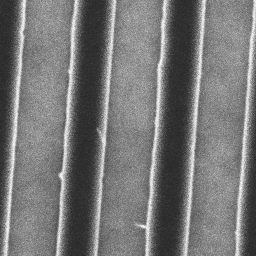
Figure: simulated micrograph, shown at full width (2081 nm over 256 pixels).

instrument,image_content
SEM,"one or a few lines or trenches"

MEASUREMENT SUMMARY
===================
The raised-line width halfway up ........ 324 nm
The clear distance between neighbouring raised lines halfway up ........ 49.6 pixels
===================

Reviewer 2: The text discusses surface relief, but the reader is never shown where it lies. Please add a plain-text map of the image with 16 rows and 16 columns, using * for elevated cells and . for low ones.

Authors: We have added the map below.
**...**...***...
*....**...***...
*....**...***...
*...***...***...
*...***...**....
*...***...**....
*...***...**...*
*...***...**...*
*...***...**...*
*...**....**...*
*...**....**...*
*...**...***...*
*...**...***...*
*...**...***...*
*...**...***...*
....**...***...*